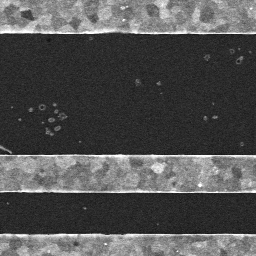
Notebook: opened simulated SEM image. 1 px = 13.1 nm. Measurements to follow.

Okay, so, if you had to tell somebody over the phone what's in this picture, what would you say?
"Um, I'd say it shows wiring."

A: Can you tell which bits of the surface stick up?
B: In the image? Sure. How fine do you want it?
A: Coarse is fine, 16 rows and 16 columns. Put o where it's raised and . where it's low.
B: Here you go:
oooooooooooooooo
oooooooooooooooo
................
................
................
................
................
................
................
................
oooooooooooooooo
oooooooooooooooo
................
................
................
oooooooooooooooo